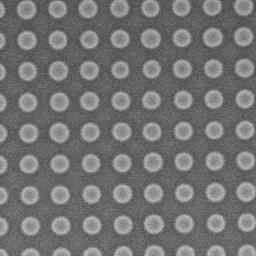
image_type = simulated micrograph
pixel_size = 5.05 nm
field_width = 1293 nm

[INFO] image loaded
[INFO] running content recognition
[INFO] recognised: an array of small figures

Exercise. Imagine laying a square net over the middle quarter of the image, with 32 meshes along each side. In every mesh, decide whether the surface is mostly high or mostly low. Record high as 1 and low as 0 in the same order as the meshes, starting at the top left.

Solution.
00000111000011110000111100001111
10001111000011110000111100001111
10001111000011110000111100001110
00000110000000000000000000000000
00000000000000000000000000000000
00000000000000000000000000000000
00000000000000000000000000000000
00000111000001100000011000001110
10001111000011110000111100001111
10001111100011110000111100001111
10000111000001110000111000001110
00000000000000000000000000000000
00000000000000000000000000000000
00000000000000000000000000000000
00000000000000000000000000000000
00000111000001110000011100001110
10000111100011110000111100001111
10001111100011110000111100001111
10000111000001110000011000000110
00000000000000000000000000000000
00000000000000000000000000000000
00000000000000000000000000000000
00000000000000000000001000000110
00000111000001110000111100001111
10000111100001111000111100001111
10000111100001110000111100001111
00000111000001110000011000000000
00000000000000000000000000000000
00000000000000000000000000000000
00000000000000000000000000000000
00000000000000110000011000000110
10000111100001111000111100001111